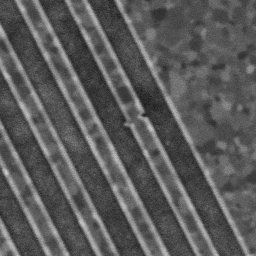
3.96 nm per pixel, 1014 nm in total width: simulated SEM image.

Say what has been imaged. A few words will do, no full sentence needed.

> parallel lines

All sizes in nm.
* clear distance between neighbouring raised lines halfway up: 109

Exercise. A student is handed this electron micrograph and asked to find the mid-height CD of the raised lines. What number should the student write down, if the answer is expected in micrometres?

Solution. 0.0669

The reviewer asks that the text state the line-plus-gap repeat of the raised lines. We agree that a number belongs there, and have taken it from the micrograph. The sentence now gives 175 nanometers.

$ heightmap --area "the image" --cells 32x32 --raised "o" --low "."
..ooo....oo....ooooooooooooooooo
...oo....oo....ooooooooooooooooo
...ooo....oo....oooooooooooooooo
....oo....oo....oooooooooooooooo
o...ooo....oo....ooooooooooooooo
o....oo....oo....ooooooooooooooo
oo...ooo....oo....oooooooooooooo
oo....oo....oo....oooooooooooooo
ooo....oo....oo....ooooooooooooo
.oo....oo....oo....ooooooooooooo
.ooo....oo....oo....oooooooooooo
..oo....oo....ooo...oooooooooooo
..ooo....oo....oo....ooooooooooo
...oo....oo....ooo...ooooooooooo
...ooo....oo....oo....oooooooooo
....oo....oo....ooo...oooooooooo
....ooo....oo....oo....ooooooooo
o....oo....oo....ooo....oooooooo
o....ooo....oo....oo....oooooooo
oo....oo....oo....ooo....ooooooo
ooo...ooo....oo....oo....ooooooo
.oo....oo....ooo...ooo....oooooo
.ooo...ooo....oo....oo....oooooo
..oo....oo....ooo...ooo....ooooo
..ooo...ooo....oo....oo....ooooo
...oo....oo....ooo...ooo....oooo
...ooo....oo....oo....oo....oooo
....oo....oo....ooo...ooo....ooo
....ooo....oo....oo....oo....ooo
o....oo....oo....ooo...ooo....oo
o....ooo....oo....oo....oo....oo
oo....oo....oo....ooo...ooo....o